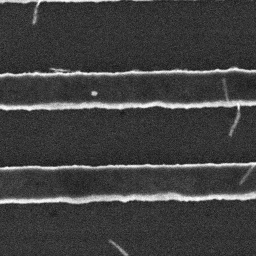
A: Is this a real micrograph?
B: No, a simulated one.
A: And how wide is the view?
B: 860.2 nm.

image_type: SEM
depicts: lines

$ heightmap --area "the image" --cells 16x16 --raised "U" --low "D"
DDDDDDDDDDDDDDDD
DDDDDDDDDDDDDDDD
DDDDDDDDDDDDDDDD
DDDDDDDDDDDDDDDD
DDDDDDDDUUUUUUUU
UUUUUUUUUUUUUUUU
UUUUUUUUUUUUUUUU
DDDDDDDDDDDDDDDD
DDDDDDDDDDDDDDDD
DDDDDDDDDDDDDDDD
UUUUUUUUUUUUUUUU
UUUUUUUUUUUUUUUU
UUUUUUDDDDDDDDDD
DDDDDDDDDDDDDDDD
DDDDDDDDDDDDDDDD
DDDDDDDDDDDDDDDD